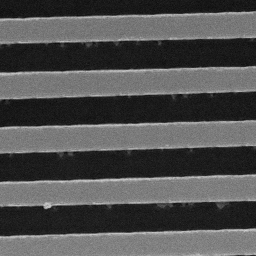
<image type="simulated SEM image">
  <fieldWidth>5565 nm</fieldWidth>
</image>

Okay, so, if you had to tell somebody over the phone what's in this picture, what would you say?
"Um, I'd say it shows lines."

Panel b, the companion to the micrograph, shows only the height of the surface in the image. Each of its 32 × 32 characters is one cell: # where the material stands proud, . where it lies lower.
................................
..............................##
################################
################################
################################
................................
................................
................................
.........................#######
################################
################################
############################....
................................
................................
................................
.................###############
################################
################################
######################..........
................................
................................
................................
............####################
################################
################################
##########......................
................................
................................
................................
.###############################
################################
################################